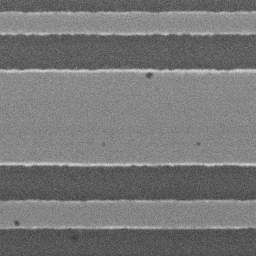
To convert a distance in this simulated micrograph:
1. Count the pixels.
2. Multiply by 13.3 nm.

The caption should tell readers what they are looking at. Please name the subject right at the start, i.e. lines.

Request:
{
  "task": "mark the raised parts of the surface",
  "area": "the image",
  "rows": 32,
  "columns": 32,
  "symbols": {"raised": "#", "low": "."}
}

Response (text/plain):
................................
...............................#
################################
################################
................................
................................
................................
................................
................................
################################
################################
################################
################################
################################
################################
################################
################################
################################
################################
################################
################################
................................
................................
................................
................................
################################
################################
################################
................................
................................
................................
................................